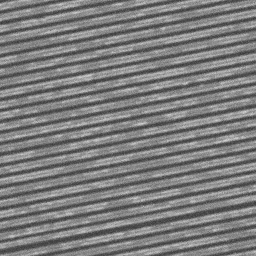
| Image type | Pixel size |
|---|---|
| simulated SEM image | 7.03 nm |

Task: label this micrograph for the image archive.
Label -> parallel lines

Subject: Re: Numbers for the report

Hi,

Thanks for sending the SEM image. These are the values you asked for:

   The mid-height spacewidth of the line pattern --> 36.3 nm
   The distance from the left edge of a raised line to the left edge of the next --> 0.0755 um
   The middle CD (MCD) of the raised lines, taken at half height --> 0.0406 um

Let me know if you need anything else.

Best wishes